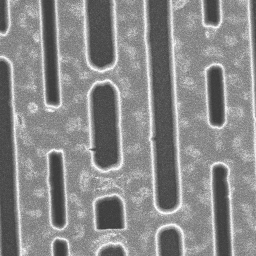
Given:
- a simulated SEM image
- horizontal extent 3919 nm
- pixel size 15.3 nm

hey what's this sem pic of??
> parallel lines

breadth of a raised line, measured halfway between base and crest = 541 nanometers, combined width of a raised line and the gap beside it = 811 nanometres